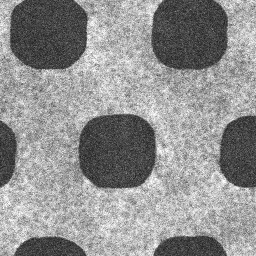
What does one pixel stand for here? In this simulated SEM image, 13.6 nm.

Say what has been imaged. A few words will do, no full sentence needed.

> holes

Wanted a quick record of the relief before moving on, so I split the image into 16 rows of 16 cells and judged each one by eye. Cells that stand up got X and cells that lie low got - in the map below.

X----XXXXX----XX
X----XXXXX----XX
X----XXXX-----XX
X----XXXXX----XX
XXXXXXXXXXXXXXXX
XXXXXXXXXXXXXXXX
XXXXXXXXXXXXXXXX
XXXXXX---XXXXXX-
-XXXX-----XXXX--
-XXXX-----XXXX--
-XXXX-----XXXX--
XXXXXX---XXXXXX-
XXXXXXXXXXXXXXXX
XXXXXXXXXXXXXXXX
XXXXXXXXXXXXXXXX
X----XXXXX----XX